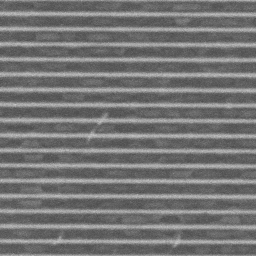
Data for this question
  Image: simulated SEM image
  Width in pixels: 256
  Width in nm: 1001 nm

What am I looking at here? parallel lines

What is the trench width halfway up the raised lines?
11.5 pixels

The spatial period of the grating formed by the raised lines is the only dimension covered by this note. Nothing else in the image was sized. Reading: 59.4 nanometers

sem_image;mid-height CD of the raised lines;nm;14.7